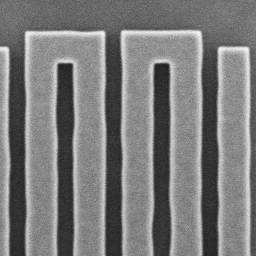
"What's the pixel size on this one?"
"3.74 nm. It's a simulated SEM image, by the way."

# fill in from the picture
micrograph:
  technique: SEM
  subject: groups of lines, slits or small figures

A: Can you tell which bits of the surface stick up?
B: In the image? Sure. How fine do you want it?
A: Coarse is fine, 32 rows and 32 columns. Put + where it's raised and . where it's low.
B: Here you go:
................................
................................
................................
................................
...++++++++++..++++++++++.......
...++++++++++..++++++++++.......
+..++++++++++..++++++++++..++++.
+..++++++++++..++++++++++..++++.
+..++++..++++..++++..++++..++++.
+..++++..++++..++++..++++..++++.
+..++++..++++..++++..++++..++++.
+..++++..++++..++++..++++..++++.
+..++++..++++..++++..++++..++++.
+..++++..++++..++++..++++..++++.
+..++++..++++..++++..++++..++++.
+..++++..++++..++++..++++..++++.
+..++++..++++..++++..++++..++++.
+..++++..++++..++++..++++..++++.
+..++++..++++..++++..++++..++++.
+..++++..++++..++++..++++..++++.
+..++++..++++..++++..++++..++++.
+..++++..++++..++++..++++..++++.
+..++++..++++..++++..++++..++++.
+..++++..++++..++++..++++..++++.
+..++++..++++..++++..++++..++++.
+..++++..++++..++++..++++..++++.
+..++++..++++..++++..++++..++++.
+..++++..++++..++++..++++..++++.
+..++++..++++..++++..++++..++++.
+..++++..++++..++++..++++..++++.
+..++++..++++..++++..++++..++++.
+..++++..++++..++++..++++..++++.